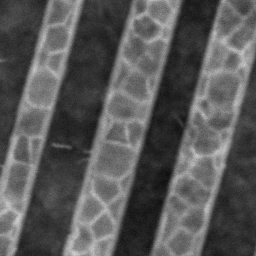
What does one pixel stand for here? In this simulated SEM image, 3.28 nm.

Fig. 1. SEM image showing one or a few lines or trenches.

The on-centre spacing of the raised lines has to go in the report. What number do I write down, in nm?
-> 281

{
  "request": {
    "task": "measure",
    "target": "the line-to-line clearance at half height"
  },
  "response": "147 nm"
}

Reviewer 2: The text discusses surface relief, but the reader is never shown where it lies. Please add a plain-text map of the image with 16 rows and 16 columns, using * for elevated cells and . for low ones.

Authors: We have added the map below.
...**...***...**
...**...***..***
...*....***..***
..**...***...***
..**...***...***
..**...***..***.
.**....**...***.
.**...***...***.
.**...***...**..
.**...***..***..
**....**...***..
**...***...***..
**...***..***...
*....***..***...
*...***...***...
*...***...***...